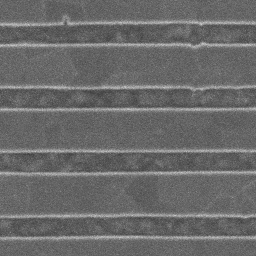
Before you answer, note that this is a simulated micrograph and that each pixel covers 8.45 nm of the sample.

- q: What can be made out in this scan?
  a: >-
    one or a few lines or trenches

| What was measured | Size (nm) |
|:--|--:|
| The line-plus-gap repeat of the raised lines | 541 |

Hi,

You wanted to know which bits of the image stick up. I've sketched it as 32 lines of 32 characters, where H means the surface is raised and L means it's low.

HHHHHHHHHHHHHHHHHHHHHHHHHHHHHHHH
HHHHHHHHHHHHHHHHHHHHHHHHHHHHHHHH
HHHHHHHHHHHHHHHHHHHHHHHHHHHHHHHH
LLLLLLLLLLLLLLLLLLLLLLLLLLLLLLLL
LLLLLLLLLLLLLLLLLLLLLLLLLLLLLLLL
LLLLLLLLLLLLLLLLLLLLLLLLLHLLLLLL
HHHHHHHHHHHHHHHHHHHHHHHHHHHHHHHH
HHHHHHHHHHHHHHHHHHHHHHHHHHHHHHHH
HHHHHHHHHHHHHHHHHHHHHHHHHHHHHHHH
HHHHHHHHHHHHHHHHHHHHHHHHHHHHHHHH
HHHHHHHHHHHHHHHHHHHHHHHHHHHHHHHH
LLLLLLLLLLLLLLLLLLLLLLLLLLLLLLLL
LLLLLLLLLLLLLLLLLLLLLLLLLLLLLLLL
LLLLLLLLLLLLLLLLLLLLLLLLLLLLLLLL
HHHHHHHHHHHHHHHHHHHHHHHHHHHHHHHH
HHHHHHHHHHHHHHHHHHHHHHHHHHHHHHHH
HHHHHHHHHHHHHHHHHHHHHHHHHHHHHHHH
HHHHHHHHHHHHHHHHHHHHHHHHHHHHHHHH
HHHHHHHHHHHHHHHHHHHHHHHHHHHHHHHH
LLLLLLLLLLLLLLLLLLLLLLLLLLLLLLLL
LLLLLLLLLLLLLLLLLLLLLLLLLLLLLLLL
LLLLLLLLLLLLLLLLLLLLLLLLLLLLLLLL
HHHHHHHHHHHHHHHHHHHHHHHHHHHHHHHH
HHHHHHHHHHHHHHHHHHHHHHHHHHHHHHHH
HHHHHHHHHHHHHHHHHHHHHHHHHHHHHHHH
HHHHHHHHHHHHHHHHHHHHHHHHHHHHHHHH
HHHHHHHHHHHHHHHHHHHHHHHHHHHHHHHH
LLLLLLLLLLLLLLLLLLLLLLLLLLLLLLLL
LLLLLLLLLLLLLLLLLLLLLLLLLLLLLLLL
LLLLLLLLLLLLLLLLLLLLLLLLLLLLLLLL
HHHHHHHHHHHHHHHHHHHHHHHHHHHHHHHH
HHHHHHHHHHHHHHHHHHHHHHHHHHHHHHHH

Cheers